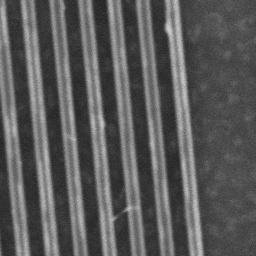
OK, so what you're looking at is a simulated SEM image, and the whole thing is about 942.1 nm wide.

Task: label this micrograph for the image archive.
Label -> parallel lines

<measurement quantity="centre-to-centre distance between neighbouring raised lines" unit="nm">106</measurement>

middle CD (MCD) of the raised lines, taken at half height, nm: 37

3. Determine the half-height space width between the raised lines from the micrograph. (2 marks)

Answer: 66.8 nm